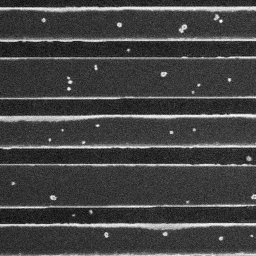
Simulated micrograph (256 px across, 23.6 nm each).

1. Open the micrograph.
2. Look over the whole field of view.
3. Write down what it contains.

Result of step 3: lines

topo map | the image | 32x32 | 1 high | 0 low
00000000000000000000000000000000
11111111111111111111111111111111
11111111111111111111111111111111
11111111111111111111111111111111
11111111111111111111111111111111
00000000000000000000000000000000
00000000000000000000000000000000
11111111111111111111111111111111
11111111111111111111111111111111
11111111111111111111111111111111
11111111111111111111111111111111
11111111111111111111111111111111
00000000000000000000000000000000
00000000000000000000000000000000
00000000000000000000000000001111
11111111111111111111111111111111
11111111111111111111111111111111
11111111111111111111111111111111
01000000000000000000000000000000
00000000000000000000000000000000
00000000000000000000000000000000
11111111111111111111111111111111
11111111111111111111111111111111
11111111111111111111111111111111
11111111111111111111111111111111
11111111111111111111111111111111
00000000000000000000000000000000
00000000000000000000000000000000
11111111111111111111111111111111
11111111111111111111111111111111
11111111111111111111111111111111
11111111111111111111111111111111